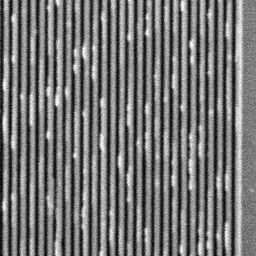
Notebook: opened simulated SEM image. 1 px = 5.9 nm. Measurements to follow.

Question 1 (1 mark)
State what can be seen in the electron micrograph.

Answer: parallel lines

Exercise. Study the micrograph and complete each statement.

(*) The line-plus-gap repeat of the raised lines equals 52.7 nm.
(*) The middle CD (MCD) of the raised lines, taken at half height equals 0.0339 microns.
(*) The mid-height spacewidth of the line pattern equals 22.1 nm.